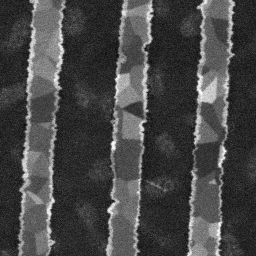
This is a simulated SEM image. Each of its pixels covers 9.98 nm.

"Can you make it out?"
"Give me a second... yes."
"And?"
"one or a few lines or trenches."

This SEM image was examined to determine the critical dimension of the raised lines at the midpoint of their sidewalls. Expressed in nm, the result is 287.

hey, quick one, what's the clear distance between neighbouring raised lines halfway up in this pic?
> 55.1 pixels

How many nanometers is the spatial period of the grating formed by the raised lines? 845